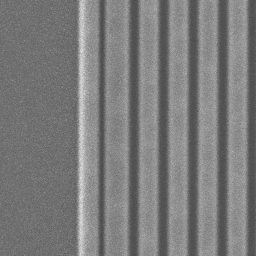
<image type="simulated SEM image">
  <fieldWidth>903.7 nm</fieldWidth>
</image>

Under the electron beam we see parallel lines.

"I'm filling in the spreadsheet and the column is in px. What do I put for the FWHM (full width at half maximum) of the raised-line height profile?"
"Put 18.2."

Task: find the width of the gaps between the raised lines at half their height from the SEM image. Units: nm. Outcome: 40.6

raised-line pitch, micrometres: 0.105